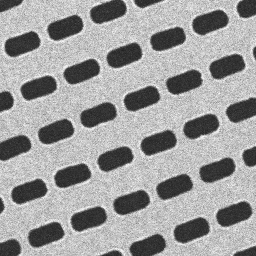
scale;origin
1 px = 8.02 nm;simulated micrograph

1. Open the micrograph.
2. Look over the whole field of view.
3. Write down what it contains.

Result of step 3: a regular array of holes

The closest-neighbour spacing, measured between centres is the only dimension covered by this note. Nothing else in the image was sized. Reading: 366 nm